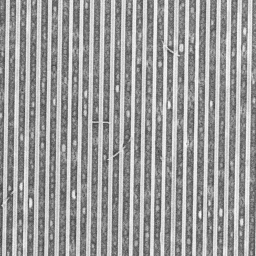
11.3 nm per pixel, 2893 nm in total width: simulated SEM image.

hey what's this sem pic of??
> parallel lines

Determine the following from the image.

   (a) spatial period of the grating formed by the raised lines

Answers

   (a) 0.119 µm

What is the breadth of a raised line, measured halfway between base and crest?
42.4 nanometres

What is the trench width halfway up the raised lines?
76.2 nanometers